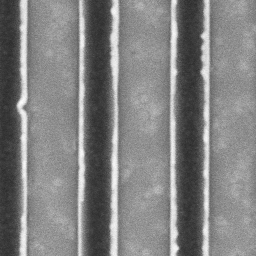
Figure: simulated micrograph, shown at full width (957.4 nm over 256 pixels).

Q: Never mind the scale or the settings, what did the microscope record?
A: one or a few lines or trenches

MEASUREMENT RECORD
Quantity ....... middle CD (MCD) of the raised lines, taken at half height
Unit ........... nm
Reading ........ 139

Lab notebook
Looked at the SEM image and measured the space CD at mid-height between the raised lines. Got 202 nm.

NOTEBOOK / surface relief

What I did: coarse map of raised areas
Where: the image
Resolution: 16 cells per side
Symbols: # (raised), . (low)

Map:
##...##....##...
##...##....##...
##...##....##...
##...##....##...
##...##....##...
##...##....##...
#....##....##...
##...##....##...
##...##....##...
##...##....##...
##...##....##...
##...##....##...
##...##....##...
##...##....##...
##...##....##...
##...##....##...